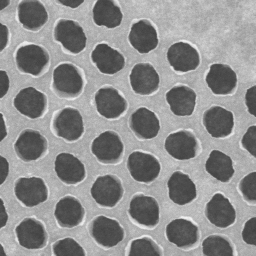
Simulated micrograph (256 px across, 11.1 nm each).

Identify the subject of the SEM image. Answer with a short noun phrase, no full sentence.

a regular array of holes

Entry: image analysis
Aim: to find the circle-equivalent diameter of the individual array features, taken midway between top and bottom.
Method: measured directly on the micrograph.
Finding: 31.2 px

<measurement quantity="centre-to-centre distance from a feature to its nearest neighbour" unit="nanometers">469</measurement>